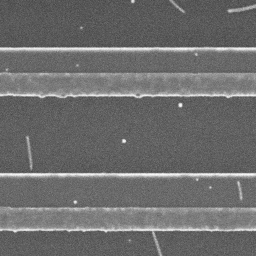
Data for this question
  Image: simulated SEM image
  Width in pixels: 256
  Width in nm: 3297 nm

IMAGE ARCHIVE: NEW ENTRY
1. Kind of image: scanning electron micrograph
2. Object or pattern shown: lines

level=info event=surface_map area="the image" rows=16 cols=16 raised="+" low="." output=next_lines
................
................
................
++++++++++++++++
++++++++++++++++
++++++++++++++++
................
................
................
................
................
++++++++++++++++
++++++++++++++++
++++++++++++++++
................
................